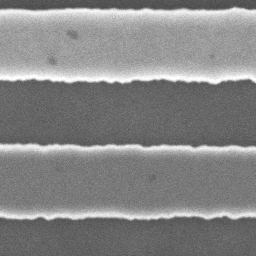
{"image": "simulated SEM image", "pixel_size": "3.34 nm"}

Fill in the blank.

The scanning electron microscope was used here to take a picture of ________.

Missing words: lines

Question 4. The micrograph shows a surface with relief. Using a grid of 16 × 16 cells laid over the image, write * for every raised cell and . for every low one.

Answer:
................
****************
****************
****************
****************
................
................
................
................
****************
****************
****************
****************
****************
................
................